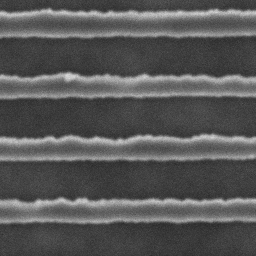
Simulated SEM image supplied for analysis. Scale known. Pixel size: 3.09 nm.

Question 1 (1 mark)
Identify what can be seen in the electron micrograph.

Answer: lines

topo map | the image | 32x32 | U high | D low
DDDDDDDDDDDDDDDDDDDDDDDDDDDDDDDD
DDDDUUUUUDDUDDDDDDDDDDDDUDUUUUUU
UUUUUUUUUUUUUUUUUUUUUUUUUUUUUUUU
UUUUUUUUUUUUUUUUUUUUUUUUUUUUUUUU
UUUUUUUUUUUUUUUDUUUUDUUUUUUUUDDD
DDDDDDDDDDDDDDDDDDDDDDDDDDDDDDDD
DDDDDDDDDDDDDDDDDDDDDDDDDDDDDDDD
DDDDDDDDDDDDDDDDDDDDDDDDDDDDDDDD
DDDDDDDDDDDDDDDDDDDDDDDDDDDDDDDD
DDDDDDUUUUDDDDDDDDDDDDDUDDDDDDDD
UUUUUUUUUUUUUUUUUUUUUUUUUUUUUUUU
UUUUUUUUUUUUUUUUUUUUUUUUUUUUUUUU
DDDDDDDDDDDDDDDDDDDDDDDDDDDDDDDD
DDDDDDDDDDDDDDDDDDDDDDDDDDDDDDDD
DDDDDDDDDDDDDDDDDDDDDDDDDDDDDDDD
DDDDDDDDDDDDDDDDDDDDDDDDDDDDDDDD
DDDDDDDDDDDDDDDDDDDDDDDDDDDDDDDD
UUDUUUUUUUUUUDDDUUUUUUUUUUUUUUUU
UUUUUUUUUUUUUUUUUUUUUUUUUUUUUUUU
UUUUUUUUUUUUUUUUUUUUUUUUUUUUUUUU
DDDDDDDDDDDDDDDDDDDDDDDDDDDDDDDD
DDDDDDDDDDDDDDDDDDDDDDDDDDDDDDDD
DDDDDDDDDDDDDDDDDDDDDDDDDDDDDDDD
DDDDDDDDDDDDDDDDDDDDDDDDDDDDDDDD
DDDDDDDDDDDDDDDDDDDDDDDDDDDDDDDD
UUUUUUUUUUUUUUUUUUUUUUUUUUUUUUUU
UUUUUUUUUUUUUUUUUUUUUUUUUUUUUUUU
UUUUUUUUUUUUUUUUUUUUUUUUUUUUUDUU
DDDDDDDDDDDDDDDDDDDDDDDDDDDDDDDD
DDDDDDDDDDDDDDDDDDDDDDDDDDDDDDDD
DDDDDDDDDDDDDDDDDDDDDDDDDDDDDDDD
DDDDDDDDDDDDDDDDDDDDDDDDDDDDDDDD